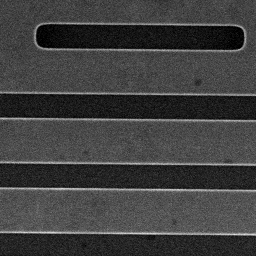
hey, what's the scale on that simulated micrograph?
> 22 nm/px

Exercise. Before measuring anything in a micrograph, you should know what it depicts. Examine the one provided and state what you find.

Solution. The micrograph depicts groups of lines, slits or small figures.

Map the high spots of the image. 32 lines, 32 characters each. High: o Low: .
oooooooooooooooooooooooooooooooo
oooooooooooooooooooooooooooooooo
oooooooooooooooooooooooooooooooo
ooooo.........................oo
oooo...........................o
ooooo.........................oo
oooooooooooooooooooooooooooooooo
oooooooooooooooooooooooooooooooo
oooooooooooooooooooooooooooooooo
oooooooooooooooooooooooooooooooo
oooooooooooooooooooooooooooooooo
oooooooooooooooooooooooooooooooo
................................
................................
................................
oooooooooooooooooooooooooooooooo
oooooooooooooooooooooooooooooooo
oooooooooooooooooooooooooooooooo
oooooooooooooooooooooooooooooooo
oooooooooooooooooooooooooooooooo
.................ooooooooooooooo
................................
................................
................................
oooooooooooooooooooooooooooooooo
oooooooooooooooooooooooooooooooo
oooooooooooooooooooooooooooooooo
oooooooooooooooooooooooooooooooo
oooooooooooooooooooooooooooooooo
................................
................................
................................